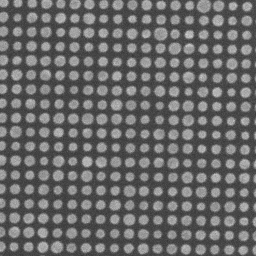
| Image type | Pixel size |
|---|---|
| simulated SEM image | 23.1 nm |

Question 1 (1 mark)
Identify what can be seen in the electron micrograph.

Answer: a regular array of raised bodies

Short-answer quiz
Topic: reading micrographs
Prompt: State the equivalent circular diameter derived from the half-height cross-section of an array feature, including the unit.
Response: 207 nanometres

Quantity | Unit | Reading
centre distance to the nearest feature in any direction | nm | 326